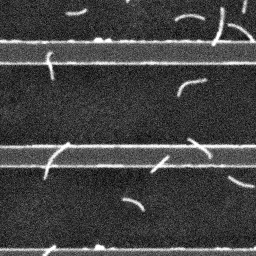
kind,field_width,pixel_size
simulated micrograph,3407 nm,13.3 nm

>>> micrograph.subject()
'lines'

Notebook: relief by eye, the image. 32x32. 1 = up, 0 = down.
00000000000000000000000000000000
00000000000000000000000000000000
00000000000000000000000000000000
00000000000000000000000000000000
00000000000000000000000000000000
11111111111111111111111111111111
11111111111111111111111111111111
11111111111111111111111111111111
00000000000000000000000000000000
00000000000000000000000000000000
00000000000000000000000000000000
00000000000000000000000000000000
00000000000000000000000000000000
00000000000000000000000000000000
00000000000000000000000000000000
00000000000000000000000000000000
00000000000000000000000000000000
00000000000000000000000000000000
11111111111111111111111111111111
11111111111111111111111111111111
11111111111111111111111111111111
00000000000000000000000000000000
00000000000000000000000000000000
00000000000000000000000000000000
00000000000000000000000000000000
00000000000000000000000000000000
00000000000000000000000000000000
00000000000000000000000000000000
00000000000000000000000000000000
00000000000000000000000000000000
00000000000000000000000000000000
11111111111111111111111111111111